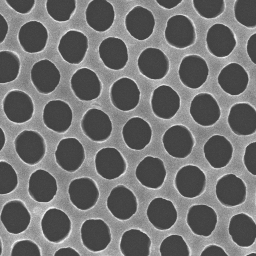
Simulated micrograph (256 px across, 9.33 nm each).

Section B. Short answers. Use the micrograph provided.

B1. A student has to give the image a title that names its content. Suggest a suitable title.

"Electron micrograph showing a regular array of holes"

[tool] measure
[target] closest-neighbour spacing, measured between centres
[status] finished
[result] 376 nm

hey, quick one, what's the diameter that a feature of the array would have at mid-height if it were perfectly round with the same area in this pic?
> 30.6 pixels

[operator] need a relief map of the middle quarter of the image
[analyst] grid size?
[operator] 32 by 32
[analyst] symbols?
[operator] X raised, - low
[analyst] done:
XXXXXXXXXXX----XXXX-------XXX---
XXXX---XXXXXXXXXXXX-------XXX---
XX------XXXXXXXXXXXX-----XXXX---
XX------XXXXXXX-XXXXX---XXXXX---
XX-------XXXX-----XXXXXXXXXXXX--
XX-------XXX------XXXXXX--XXXXX-
XX-------XXX-------XXXX----XXXXX
XXX------XXX-------XXX------XXXX
XXXX----XXXX-------XXX-------XXX
XXXXXXXXXXXX-------XXX-------XXX
-XXXXXXXXXXXX-----XXXX-------XXX
--XXXX---XXXXX---XXXXX-------XX-
--XXX------XXXXXXXXXXXX-----XXXX
--XXX------XXXXXX--XXXXXX--XXXXX
--XXX-------XXXX-----XXXXXXXXXXX
-XXX--------XXX------XXXXXX--XXX
-XXXX-------XXX-------XXXX-----X
XXXXXX------XXX-------XXX-------
XXXXXXX---XXXXX-------XXX-------
----XXXXXXXXXXX------XXXX-------
-----XXXXXXXXXXX----XXXXX-------
-----XXXX----XXXXXXXXXXXX-------
-----XXX------XXXXXXXXXXXX-----X
-----XXX-------XXXXX---XXXXXX-XX
-----XXX-------XXXX------XXXXXXX
----XXXX-------XXX-------XXXXXX-
---XXXXX-------XXX--------XXX---
XXXXXXXXX-----XXXX--------XX----
XXXXXXXXXX---XXXXX-------XXX----
XX-----XXXXXXXXXXXX------XXX----
X-------XXXXXXXXXXXX----XXXX----
X-------XXXX----XXXXXXXXXXXXX---